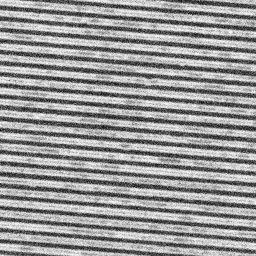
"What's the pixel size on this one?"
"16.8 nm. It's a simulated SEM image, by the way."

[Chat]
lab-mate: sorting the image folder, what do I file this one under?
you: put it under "parallel lines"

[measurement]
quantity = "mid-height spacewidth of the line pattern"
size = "5.73 px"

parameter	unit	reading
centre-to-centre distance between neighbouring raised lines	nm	186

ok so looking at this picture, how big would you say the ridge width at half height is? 81.3 nm